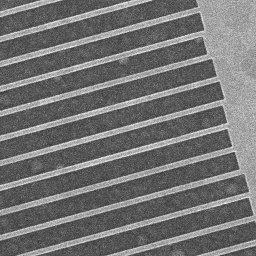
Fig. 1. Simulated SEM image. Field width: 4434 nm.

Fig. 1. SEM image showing parallel lines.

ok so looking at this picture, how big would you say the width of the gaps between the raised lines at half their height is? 0.328 um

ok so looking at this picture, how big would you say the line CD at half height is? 83.5 nanometres